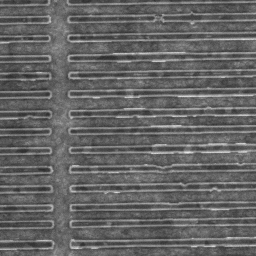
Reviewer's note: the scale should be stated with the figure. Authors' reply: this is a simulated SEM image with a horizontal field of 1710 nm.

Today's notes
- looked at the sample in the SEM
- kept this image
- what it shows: parallel lines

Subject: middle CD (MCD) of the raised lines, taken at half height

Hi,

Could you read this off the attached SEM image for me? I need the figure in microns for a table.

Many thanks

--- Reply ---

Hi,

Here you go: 0.0401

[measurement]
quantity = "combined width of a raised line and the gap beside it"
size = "125 nm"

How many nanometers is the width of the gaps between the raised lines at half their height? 86